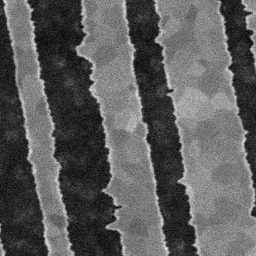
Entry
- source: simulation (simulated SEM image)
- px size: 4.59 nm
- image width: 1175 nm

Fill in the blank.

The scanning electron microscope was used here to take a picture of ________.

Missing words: one or a few lines or trenches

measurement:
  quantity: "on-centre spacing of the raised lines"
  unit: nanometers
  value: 385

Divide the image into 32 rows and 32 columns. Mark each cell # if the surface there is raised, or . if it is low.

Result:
.##.......######...#########..##
.###......######....########...#
.###......######....########...#
.###......######....########...#
.###.......#####....########...#
.###......######....########....
..###.....#######...#########..#
..###......######...#########...
..###.......#####....########...
..###......######....########...
..###.......#####....########...
..####.....######....########...
...###......#####.....########..
...###.......#####....########..
...###.......#####....########..
...####......#####....########..
...####......#####....#########.
...####......#####.....########.
....###......######....########.
....###.......#####....########.
....###.......#####....########.
....###.......#####....########.
....###.......#####....########.
.....##......######....#########
.....###......######....########
.....###......######....########
.....###......######....#######.
.....###......######....########
......##......######....########
......##.......#####.....#######
......###......######...########
......###......######....#######